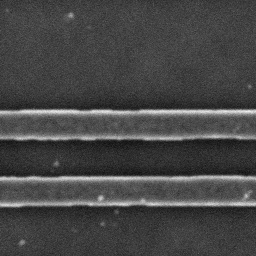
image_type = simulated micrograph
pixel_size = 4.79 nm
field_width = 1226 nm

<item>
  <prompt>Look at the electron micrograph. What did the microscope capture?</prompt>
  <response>lines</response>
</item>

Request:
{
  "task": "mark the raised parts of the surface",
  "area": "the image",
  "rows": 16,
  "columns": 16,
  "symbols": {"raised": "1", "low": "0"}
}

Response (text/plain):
0000000000000000
0000000000000000
0000000000000000
0000000000000000
0000000000000000
0000000000000000
0000000000000000
1111111111111111
1111111111111111
0000000000000000
0000000000000000
1111111111111111
1111111111111111
0000000000000000
0000000000000000
0000000000000000